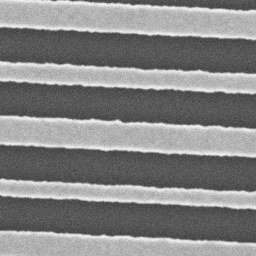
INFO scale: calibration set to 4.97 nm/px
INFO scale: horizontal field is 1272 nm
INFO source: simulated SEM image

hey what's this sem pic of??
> lines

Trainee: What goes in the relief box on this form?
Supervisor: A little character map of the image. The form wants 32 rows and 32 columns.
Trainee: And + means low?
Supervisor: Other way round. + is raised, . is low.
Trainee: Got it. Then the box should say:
+++++++++++++++.................
++++++++++++++++++++++++++++++++
++++++++++++++++++++++++++++++++
....++++++++++++++++++++++++++++
.........................+++++++
................................
................................
................................
+++++++++++++++.................
++++++++++++++++++++++++++++++++
........+.++++++++++++++++++++++
............................++++
................................
................................
................................
+++++++++++++++++++++...........
++++++++++++++++++++++++++++++++
++++++++++++++++++++++++++++++++
...........+++++++++++++++++++++
..............................++
................................
................................
+...............................
+++++++++++++++++++.............
..++++++++++++++++++++++++++++++
......................++++++++++
................................
................................
................................
+++++++++++++...................
++++++++++++++++++++++++++++++++
++++++++++++++++++++++++++++++++